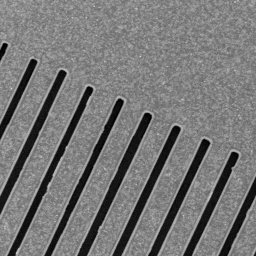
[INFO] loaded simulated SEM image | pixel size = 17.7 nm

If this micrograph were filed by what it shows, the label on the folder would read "parallel lines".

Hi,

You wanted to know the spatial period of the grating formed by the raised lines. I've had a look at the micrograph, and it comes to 31.8 px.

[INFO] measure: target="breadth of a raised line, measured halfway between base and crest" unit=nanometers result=385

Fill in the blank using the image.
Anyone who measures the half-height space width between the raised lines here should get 0.176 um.